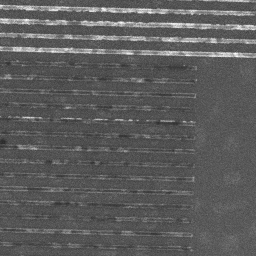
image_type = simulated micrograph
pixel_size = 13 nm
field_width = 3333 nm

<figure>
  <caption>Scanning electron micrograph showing parallel lines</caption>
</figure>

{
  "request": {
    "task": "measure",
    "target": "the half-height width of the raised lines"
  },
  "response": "47.2 nm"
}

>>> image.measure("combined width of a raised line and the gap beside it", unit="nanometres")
182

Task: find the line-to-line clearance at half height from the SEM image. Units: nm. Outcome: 140